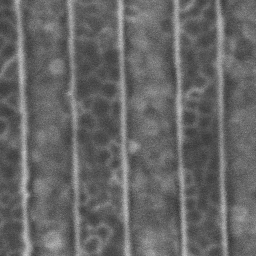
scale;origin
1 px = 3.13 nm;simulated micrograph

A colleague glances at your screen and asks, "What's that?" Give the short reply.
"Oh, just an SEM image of one or a few lines or trenches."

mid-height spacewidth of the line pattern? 169 nm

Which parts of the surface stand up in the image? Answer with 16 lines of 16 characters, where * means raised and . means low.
*...****...***..
*...****...***..
*...****...***..
*....***...***..
*....***...***..
*...****...***..
*....***...***..
*....***...***..
**...***...***..
**...***...***..
**...***...***..
**...***...***..
**...***...***..
**...***...***..
**...***...***..
**...***....**..